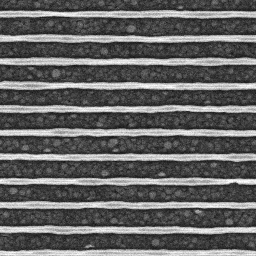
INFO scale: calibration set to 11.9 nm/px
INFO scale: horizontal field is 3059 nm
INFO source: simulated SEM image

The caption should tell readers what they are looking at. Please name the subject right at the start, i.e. parallel lines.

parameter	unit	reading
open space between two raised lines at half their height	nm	221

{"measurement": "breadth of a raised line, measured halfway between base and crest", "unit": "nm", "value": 65.7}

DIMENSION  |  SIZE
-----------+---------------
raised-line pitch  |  287 nm